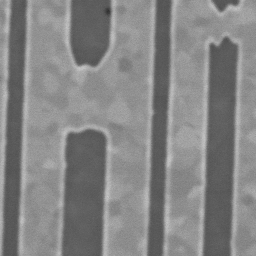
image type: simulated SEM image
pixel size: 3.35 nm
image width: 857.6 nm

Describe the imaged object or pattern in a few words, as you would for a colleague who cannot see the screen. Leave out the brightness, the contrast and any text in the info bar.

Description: one or a few lines or trenches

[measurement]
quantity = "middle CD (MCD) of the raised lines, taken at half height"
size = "132 nm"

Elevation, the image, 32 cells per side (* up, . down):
*...*****.....*****...****....**
*...*****.....*****...*****.****
*...*****.....*****...**********
*...*****.....*****...**********
*...****......*****...**********
*...*****.....*****...****....**
*..******.....*****...****....**
*..******....******...****....**
*..********.*******..*****....**
*..****************..*****....**
*..****************..*****....**
*..****************..*****....**
*..****************..*****....**
*..****************..*****....**
*..****************..*****....**
...****************..*****....**
...*****.....******..*****....**
*..*****......*****..*****....**
...*****......*****..*****....**
...*****......*****..*****....**
...*****......*****..****.....**
...*****......****...****.....**
...*****.....*****...*****...***
...*****.....*****...****....***
...*****.....*****...****....***
...*****.....*****...****....***
...*****.....*****...****....***
...*****.....*****...****....***
...*****.....*****...****....***
...****......*****...****....***
...****......*****...****....***
...****......*****...****....***